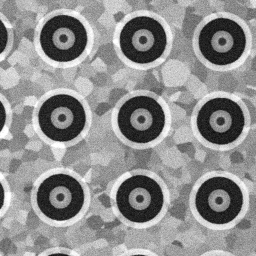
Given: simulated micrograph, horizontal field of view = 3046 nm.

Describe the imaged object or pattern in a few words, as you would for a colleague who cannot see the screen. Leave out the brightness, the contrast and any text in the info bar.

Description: an array of small figures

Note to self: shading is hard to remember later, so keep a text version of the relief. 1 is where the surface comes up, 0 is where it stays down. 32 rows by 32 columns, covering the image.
11111111111111111111111111111111
11111111111111111111111111111111
01111100001111110000111111000011
01111000000111100000011110000001
01111001100111100110011110010001
01111001100111100110011100011001
01111000000111100000011110000001
11111100001111110000111110000011
11111111111111111111111111101111
11111111111111111111111111111111
11111111111111111111111111111111
11111110111111111111111111111111
11111000001111100000111111000011
01111000000111100000011110000011
01110001100111000100011100010001
01111001000111000100011100010001
11111000000111100000011110000001
11111100001111110000111110000011
11111111111111111111111111101111
11111111111111111111111111111111
11111111111111111111111111111111
11111110011111111111111111111111
11111000001111100000111110000011
01110000000111000000111110000011
01110001000111000100011100010001
01110001000111000100011100010001
11111000001111100000111100000011
11111100011111100001111110000011
11111111111111111111111111111111
11111111111111111111111111111111
11111111111111111111111111111111
11111100111111111011111111111111